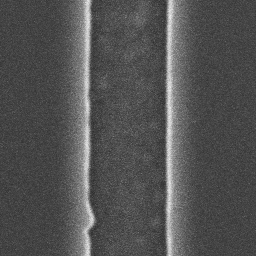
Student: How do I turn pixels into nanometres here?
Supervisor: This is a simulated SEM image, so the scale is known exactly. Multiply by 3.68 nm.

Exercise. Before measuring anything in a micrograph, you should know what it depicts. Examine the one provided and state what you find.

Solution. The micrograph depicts one or a few lines or trenches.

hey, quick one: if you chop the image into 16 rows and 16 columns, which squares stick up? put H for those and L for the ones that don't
HHHHHHLLLLLHHHHH
HHHHHHLLLLLHHHHH
HHHHHHLLLLLHHHHH
HHHHHLLLLLLHHHHH
HHHHHLLLLLLHHHHH
HHHHHLLLLLLHHHHH
HHHHHHLLLLLHHHHH
HHHHHLLLLLLHHHHH
HHHHHLLLLLLHHHHH
HHHHHLLLLLLHHHHH
HHHHHLLLLLLHHHHH
HHHHHLLLLLLHHHHH
HHHHHHLLLLLHHHHH
HHHHHHLLLLLHHHHH
HHHHHHLLLLLHHHHH
HHHHHHLLLLLHHHHH